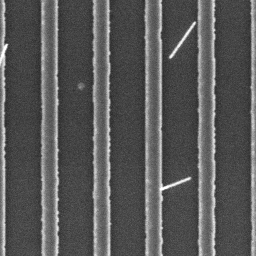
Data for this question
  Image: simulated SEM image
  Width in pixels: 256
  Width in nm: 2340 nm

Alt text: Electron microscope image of lines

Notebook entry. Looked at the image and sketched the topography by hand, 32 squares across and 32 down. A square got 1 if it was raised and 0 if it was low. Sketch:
10000110000011000011000001100000
10000110000011000011000001100000
10000110000011000011000001100000
10000110000011000011000001100000
10000110000011000011000001100000
10000110000011000011000001100000
10000110000011000011000001100000
10000110000011000011000001100000
10000110000011000011000001100000
10000110000011000011000001100000
10000110000011000011000001100000
10000110000011000011000001100000
10000110000011000011000001100000
00000110000011000011000001100000
10000110000011000011000001100000
00000110000011000011000001100000
10000110000011000011000001100000
10000110000011000011000001100000
10000110000011000011000001100000
10000110000011000011000001100000
10000110000011000011000001100000
10000110000011000011000001100000
10000110000011000011000001100000
10000110000011000011000001100000
10000110000011000011000001100000
10000110000011000011000001100000
10000110000011000011000001100000
10000110000011000011000001100000
10000110000011000011000001100000
10000110000011000011000001100000
10000110000011000011000001100000
10000110000011000011000001100000